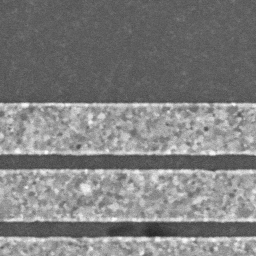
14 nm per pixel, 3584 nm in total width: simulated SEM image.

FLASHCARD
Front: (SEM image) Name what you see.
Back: one or a few lines or trenches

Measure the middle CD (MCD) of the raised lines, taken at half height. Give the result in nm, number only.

677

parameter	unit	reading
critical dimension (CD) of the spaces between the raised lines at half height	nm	252